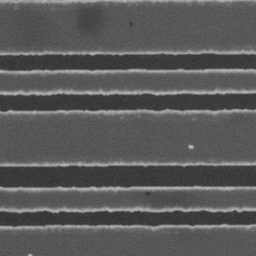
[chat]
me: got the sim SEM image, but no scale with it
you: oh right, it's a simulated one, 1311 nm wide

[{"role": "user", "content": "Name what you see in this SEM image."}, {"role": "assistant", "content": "lines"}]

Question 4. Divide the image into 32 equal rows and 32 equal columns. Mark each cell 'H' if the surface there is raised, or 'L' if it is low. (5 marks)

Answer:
HHHHHHHHHHHHHHHHHHHHHHHHHHHHHHHH
HHHHHHHHHHHHHHHHHHHHHHHHHHHHHHHH
HHHHHHHHHHHHHHHHHHHHHHHHHHHHHHHH
HHHHHHHHHHHHHHHHHHHHHHHHHHHHHHHH
HHHHHHHHHHHHHHHHHHHHHHHHHHHHHHHH
HHHHHHHHHHHHHHHHHHHHHHHHHHHHHHHH
HHHHHHHHHHHHHHHHHHHHHHHHHHHHHHHH
LLLLLLLLLLLLLLLLLLLLLLLLLLLLLLLL
LLLLLLLLLLLLLLLLLLLLLLLLLLLLLLLL
HHHHHHHHHHHHHHHHHHHHHHHHHHHHHHHH
HHHHHHHHHHHHHHHHHHHHHHHHHHHHHHHH
HHHHHHHHHHHHHHHHHHHHHHHHHHHHHHHH
LLLLLLLLLLLLLLLLLLLLLLLLLLLLLLLL
LLLLLLLLLLLLLLLLLLLLLLLLLLLLLLLL
HHHHHHHHHHHHHHHHHHHHHHHHHHHHHHHH
HHHHHHHHHHHHHHHHHHHHHHHHHHHHHHHH
HHHHHHHHHHHHHHHHHHHHHHHHHHHHHHHH
HHHHHHHHHHHHHHHHHHHHHHHHHHHHHHHH
HHHHHHHHHHHHHHHHHHHHHHHHHHHHHHHH
HHHHHHHHHHHHHHHHHHHHHHHHHHHHHHHH
HHHHHHHHHHHHHHHHHHHHHHHHHHHHHHHH
LLLLLLLLLLLLLLLLLLLLLLLLLLLLLLLL
LLLLLLLLLLLLLLLLLLLLLLLLLLLLLLLL
LLLLLLLLLLLLLLLLLLHHLHHHHHHHLHHH
HHHHHHHHHHHHHHHHHHHHHHHHHHHHHHHH
HHHHHHHHHHHHHHHHHHHHHHHHHHHHHHHH
LLLLLLLLLLLLLLLLLLLLLLLLLLLLLLLL
LLLLLLLLLLLLLLLLLLLLLLLLLLLLLLLL
HHHHHHHHHHHHHHHHHHHHHHHHHHHHHHHH
HHHHHHHHHHHHHHHHHHHHHHHHHHHHHHHH
HHHHHHHHHHHHHHHHHHHHHHHHHHHHHHHH
HHHHHHHHHHHHHHHHHHHHHHHHHHHHHHHH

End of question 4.